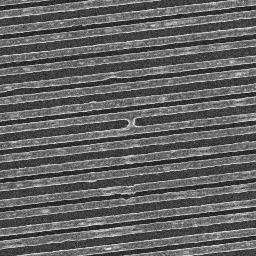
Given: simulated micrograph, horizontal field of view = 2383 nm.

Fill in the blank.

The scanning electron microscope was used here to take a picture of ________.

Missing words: parallel lines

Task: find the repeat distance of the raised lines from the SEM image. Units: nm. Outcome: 133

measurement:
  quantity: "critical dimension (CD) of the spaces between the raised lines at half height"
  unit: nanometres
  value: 58.9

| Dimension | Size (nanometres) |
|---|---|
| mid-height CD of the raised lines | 68.2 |